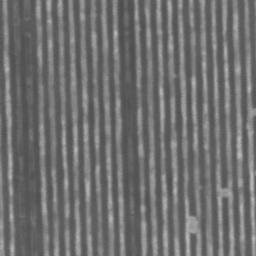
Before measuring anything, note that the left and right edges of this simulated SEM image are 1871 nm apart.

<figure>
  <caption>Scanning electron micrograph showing parallel lines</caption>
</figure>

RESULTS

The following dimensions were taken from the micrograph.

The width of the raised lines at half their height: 0.0247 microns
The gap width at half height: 53.9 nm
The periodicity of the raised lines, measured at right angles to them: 80.2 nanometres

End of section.